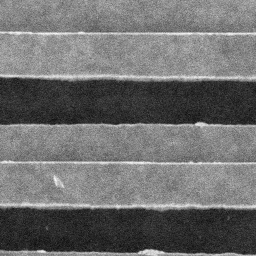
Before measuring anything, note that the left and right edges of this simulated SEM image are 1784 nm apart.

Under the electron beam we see lines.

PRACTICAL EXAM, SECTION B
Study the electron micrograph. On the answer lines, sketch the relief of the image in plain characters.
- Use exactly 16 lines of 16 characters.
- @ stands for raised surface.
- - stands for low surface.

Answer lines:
@@@@@@@@@@@@@@@@
@@@@@@@@@@@@@@@@
@@@@@@@@@@@@@@@@
@@@@@@@@@@@@@@@@
@@@@@@@@@@@@@@@@
----------------
----------------
----------------
@@@@@@@@@@@@@@@@
@@@@@@@@@@@@@@@@
@@@@@@@@@@@@@@@@
@@@@@@@@@@@@@@@@
@@@@@@@@@@@@@@@@
----------------
----------------
----------------